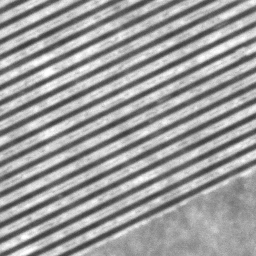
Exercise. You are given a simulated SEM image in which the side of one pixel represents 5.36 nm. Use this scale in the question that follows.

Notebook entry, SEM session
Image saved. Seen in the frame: parallel lines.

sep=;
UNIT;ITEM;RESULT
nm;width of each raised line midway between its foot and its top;36.7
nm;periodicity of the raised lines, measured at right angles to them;73.6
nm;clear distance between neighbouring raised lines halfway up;36.7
